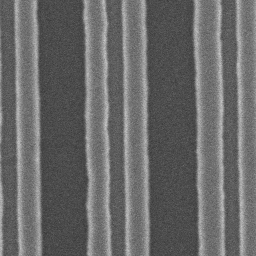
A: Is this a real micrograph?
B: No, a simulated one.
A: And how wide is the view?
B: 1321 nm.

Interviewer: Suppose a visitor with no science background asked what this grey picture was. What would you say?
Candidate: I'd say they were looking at lines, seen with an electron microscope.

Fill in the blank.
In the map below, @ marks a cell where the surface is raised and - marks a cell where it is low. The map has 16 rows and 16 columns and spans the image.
@@---@@@@---@@@@
@@---@@@@---@@@@
@@---@@@@---@@@@
@@---@@@@---@@@@
@@---@@@@---@@@@
@@---@@@@---@@@@
@@---@@@@---@@@@
@@---@@@@---@@@@
@@---@@@@---@@@@
@@---@@@@---@@@@
@@---@@@@---@@@@
@@----@@@---@@@@
@@----@@@---@@@@
@@----@@@---@@@@
@@@---@@@---@@@@
@@@---@@@----@@@